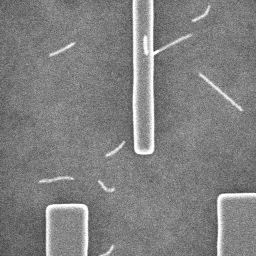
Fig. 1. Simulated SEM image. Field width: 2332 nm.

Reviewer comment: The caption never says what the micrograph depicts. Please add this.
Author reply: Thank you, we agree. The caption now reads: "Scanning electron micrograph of groups of lines, slits or small figures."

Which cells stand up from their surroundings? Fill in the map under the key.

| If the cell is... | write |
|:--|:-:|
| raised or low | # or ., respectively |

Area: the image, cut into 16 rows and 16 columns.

........##......
........##......
........##......
........##......
........##......
........##......
........##......
........##......
........##......
................
................
................
..............##
...##.........##
...##.........##
...##.........##